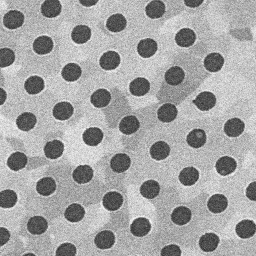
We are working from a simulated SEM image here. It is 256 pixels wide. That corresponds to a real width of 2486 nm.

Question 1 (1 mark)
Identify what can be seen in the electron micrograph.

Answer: a regular array of holes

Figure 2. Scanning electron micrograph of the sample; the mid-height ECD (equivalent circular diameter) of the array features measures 0.204 um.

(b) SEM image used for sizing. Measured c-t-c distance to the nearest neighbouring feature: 372 nm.